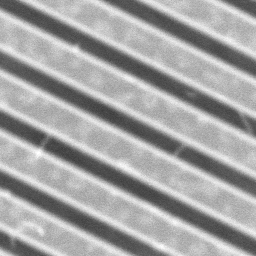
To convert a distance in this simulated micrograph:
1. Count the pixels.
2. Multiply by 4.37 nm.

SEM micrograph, parallel lines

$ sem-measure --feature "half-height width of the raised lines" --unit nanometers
143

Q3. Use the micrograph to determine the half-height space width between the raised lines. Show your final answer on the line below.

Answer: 90.7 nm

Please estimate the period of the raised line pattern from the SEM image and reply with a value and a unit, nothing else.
0.233 µm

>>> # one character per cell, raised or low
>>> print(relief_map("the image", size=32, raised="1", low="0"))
00001111111110000001111111110000
00000011111111100000011111111100
11000000111111111000000111111111
11110000001111111110000001111111
11111100000011111111100000011111
11111111000000111111111000000111
01111111110000001111111110000001
00011111111100000011111111100000
00000111111111000000111111111000
10000001111111110000001111111110
11100000011111111100000011111111
11111000000111111111000000111111
11111110000001111111110000001111
11111111100000011111111100000011
00111111111000000111111111000000
00001111111110000001111111110000
00000011111111100000011111111100
11000000111111111000000111111111
11110000001111111110000001111111
11111100000011111111100000011111
11111111000000111111111000000111
01111111110000001111111110000001
00011111111100000011111111100000
00000111111111000000111111111000
10000001111111110000001111111110
11100000011111111100000011111111
11111000000111111111000000111111
11111110000001111111110000001111
11111111100000011111111100000011
00111111111000000111111111000000
00001111111110000001111111110000
00000011111111100000011111111100